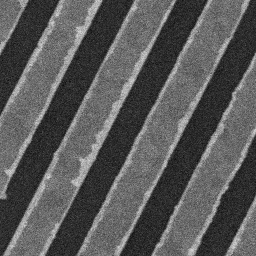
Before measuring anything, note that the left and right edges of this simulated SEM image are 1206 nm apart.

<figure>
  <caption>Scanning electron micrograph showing one or a few lines or trenches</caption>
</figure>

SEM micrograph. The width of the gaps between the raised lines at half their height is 140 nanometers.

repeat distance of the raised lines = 0.31 um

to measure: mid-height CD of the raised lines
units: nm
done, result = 169